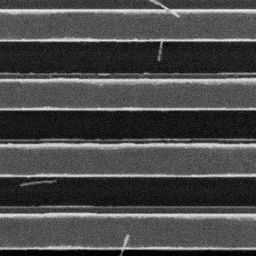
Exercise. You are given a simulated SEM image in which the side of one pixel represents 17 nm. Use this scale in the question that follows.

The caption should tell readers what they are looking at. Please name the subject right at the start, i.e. lines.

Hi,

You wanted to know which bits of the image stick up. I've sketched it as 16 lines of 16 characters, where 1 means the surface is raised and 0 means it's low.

0000000000000000
1111111111111111
1111111111111111
0000000000000000
0000000000000000
1111111111111111
1111111111111111
0000000000000000
0000000000000000
1111111111111111
1111111111111111
0000000000000000
0000000000000000
1111111111111111
1111111111111111
1111111111111111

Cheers